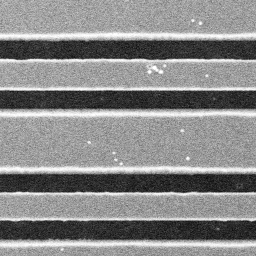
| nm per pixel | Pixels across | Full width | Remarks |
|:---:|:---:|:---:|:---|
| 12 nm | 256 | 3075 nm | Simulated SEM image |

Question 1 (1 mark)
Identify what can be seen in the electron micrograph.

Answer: lines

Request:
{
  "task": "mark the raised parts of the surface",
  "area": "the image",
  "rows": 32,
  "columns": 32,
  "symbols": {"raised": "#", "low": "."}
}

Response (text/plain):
################################
################################
################################
################################
################################
................................
................................
##.################.##########..
################################
################################
################################
................................
................................
................................
################################
################################
################################
################################
################################
################################
################################
............................#.#.
................................
................................
################################
################################
################################
.##....####.......#........##..#
................................
................................
################################
################################